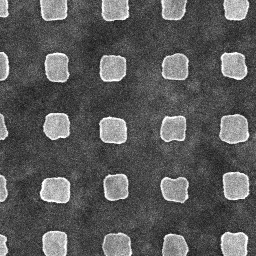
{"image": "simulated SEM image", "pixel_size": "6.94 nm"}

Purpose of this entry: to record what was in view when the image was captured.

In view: a regular array of raised bodies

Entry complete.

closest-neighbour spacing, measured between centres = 0.394 micrometres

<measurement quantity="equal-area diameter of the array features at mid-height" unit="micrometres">0.193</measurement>